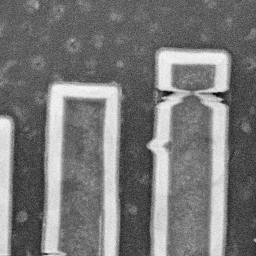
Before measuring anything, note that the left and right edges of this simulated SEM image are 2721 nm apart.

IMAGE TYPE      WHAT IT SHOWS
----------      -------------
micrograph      one or a few lines or trenches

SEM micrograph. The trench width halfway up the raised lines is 51.5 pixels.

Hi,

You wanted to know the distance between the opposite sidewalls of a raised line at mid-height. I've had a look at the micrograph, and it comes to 589 nm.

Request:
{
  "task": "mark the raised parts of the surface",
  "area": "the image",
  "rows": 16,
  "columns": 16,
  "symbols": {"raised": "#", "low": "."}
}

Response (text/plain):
................
................
................
................
..........####..
...........###..
....###....##...
....###...####..
...####...####..
...####...####..
...####...####..
...####...####..
...####...####..
...####...####..
...####...####..
...####...###...